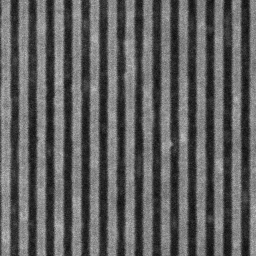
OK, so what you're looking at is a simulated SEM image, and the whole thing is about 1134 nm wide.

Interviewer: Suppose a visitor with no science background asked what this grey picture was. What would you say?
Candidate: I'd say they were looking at parallel lines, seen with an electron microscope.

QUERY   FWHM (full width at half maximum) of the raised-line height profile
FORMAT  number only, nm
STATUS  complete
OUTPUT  37.1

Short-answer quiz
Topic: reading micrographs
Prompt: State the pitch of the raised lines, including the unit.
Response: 78.4 nanometers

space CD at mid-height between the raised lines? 41.5 nm